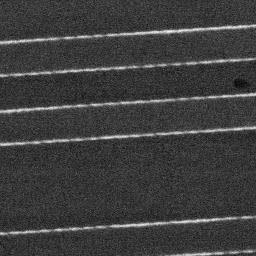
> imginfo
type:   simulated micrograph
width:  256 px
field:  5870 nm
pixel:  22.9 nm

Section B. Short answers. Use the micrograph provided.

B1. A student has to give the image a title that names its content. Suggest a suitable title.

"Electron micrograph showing lines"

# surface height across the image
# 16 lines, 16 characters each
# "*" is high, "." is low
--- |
................
................
..**************
****************
****............
................
......**********
****************
*********.......
................
................
................
................
................
.***************
****************